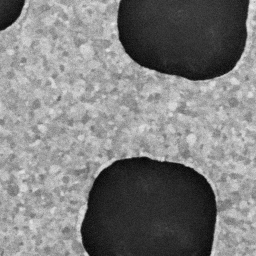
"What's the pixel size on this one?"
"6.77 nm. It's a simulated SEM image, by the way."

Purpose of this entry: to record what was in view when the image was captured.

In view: holes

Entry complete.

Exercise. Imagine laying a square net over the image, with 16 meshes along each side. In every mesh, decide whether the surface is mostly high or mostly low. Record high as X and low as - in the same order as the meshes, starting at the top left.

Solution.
-XXXXXX---------
-XXXXXX---------
XXXXXXX--------X
XXXXXXXX-------X
XXXXXXXXXX----XX
XXXXXXXXXXXXXXXX
XXXXXXXXXXXXXXXX
XXXXXXXXXXXXXXXX
XXXXXXXXXXXXXXXX
XXXXXXXXXXXXXXXX
XXXXXXX-----XXXX
XXXXXX-------XXX
XXXXX---------XX
XXXXX---------XX
XXXXX--------XXX
XXXXX--------XXX